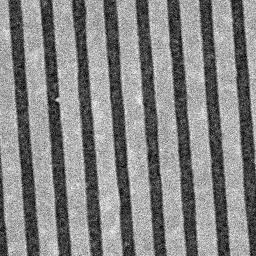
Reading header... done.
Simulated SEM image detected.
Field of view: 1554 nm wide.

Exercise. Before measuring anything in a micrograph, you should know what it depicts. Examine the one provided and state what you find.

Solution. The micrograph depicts parallel lines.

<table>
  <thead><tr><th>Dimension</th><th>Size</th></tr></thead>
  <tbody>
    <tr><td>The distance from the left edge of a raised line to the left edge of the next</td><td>31.7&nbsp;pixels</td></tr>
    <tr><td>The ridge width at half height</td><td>0.113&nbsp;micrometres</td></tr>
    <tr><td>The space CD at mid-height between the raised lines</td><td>80.2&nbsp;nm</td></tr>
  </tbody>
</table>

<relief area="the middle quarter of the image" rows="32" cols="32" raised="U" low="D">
UUUDDDUUUUUDDDUUUUUDDDDUUUUDDDUU
UUUDDDUUUUUDDDUUUUUDDDDUUUUDDDDU
UUUDDDUUUUUDDDUUUUUDDDDUUUUDDDDU
UUUDDDDUUUUDDDDUUUUDDDDUUUUDDDDU
UUUDDDDUUUUDDDDUUUUDDDDUUUUDDDDU
UUUDDDDUUUUDDDUUUUUDDDDUUUUDDDDU
UUUDDDDUUUUDDDDUUUUDDDDUUUUDDDDU
UUUDDDDUUUUDDDDUUUUDDDDUUUUDDDDU
UUUDDDDUUUUDDDDUUUUUDDDUUUUDDDDU
UUUUDDDUUUUDDDDUUUUDDDDUUUUDDDDU
UUUUDDDUUUUUDDDUUUUUDDDUUUUDDDDU
UUUUDDDUUUUUDDDUUUUUDDDUUUUUDDDU
UUUUDDDUUUUUDDDUUUUUDDDUUUUUDDDU
UUUUDDDUUUUUDDDDUUUUDDDUUUUUDDDU
UUUUDDDDUUUUDDDDUUUUDDDDUUUUDDDU
UUUUDDDDUUUUDDDDUUUUDDDDUUUUDDDU
UUUUDDDDUUUUDDDDUUUUDDDDUUUUDDDU
UUUUDDDDUUUUDDDDUUUUDDDDUUUUDDDD
UUUUDDDDUUUUDDDDUUUUDDDDUUUUDDDD
UUUUDDDDUUUUDDDDUUUUDDDDUUUUDDDD
UUUUUDDDUUUUDDDDUUUUDDDDUUUUDDDD
UUUUUDDDUUUUUDDDUUUUUDDDUUUUUDDD
UUUUUDDDUUUUDDDDUUUUUDDDUUUUUDDD
UUUUUDDDUUUUUDDDUUUUUDDDUUUUDDDD
UUUUUDDDUUUUUDDDUUUUUDDDUUUUUDDD
UUUUUDDDUUUUUDDDUUUUUDDDUUUUUDDD
DUUUUDDDUUUUUDDDUUUUUDDDUUUUUDDD
DUUUUDDDUUUUUDDDUUUUUDDDUUUUUDDD
DUUUUDDDDUUUUDDDUUUUUDDDUUUUUDDD
DUUUUDDDDUUUUDDDUUUUUDDDUUUUUDDD
DUUUUDDDDUUUUDDDDUUUUDDDDUUUUDDD
DUUUUDDDDUUUUDDDDUUUUDDDDUUUUDDD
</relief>